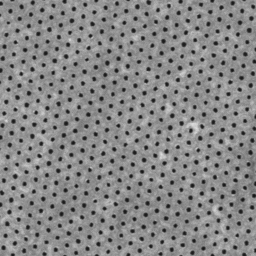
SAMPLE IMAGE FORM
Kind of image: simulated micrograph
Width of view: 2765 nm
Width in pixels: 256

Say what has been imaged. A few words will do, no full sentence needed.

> a regular array of holes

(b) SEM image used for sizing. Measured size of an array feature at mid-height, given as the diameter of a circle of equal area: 48.7 nm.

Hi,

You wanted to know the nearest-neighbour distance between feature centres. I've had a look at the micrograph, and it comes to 127 nm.